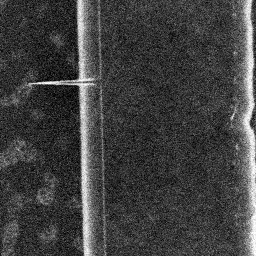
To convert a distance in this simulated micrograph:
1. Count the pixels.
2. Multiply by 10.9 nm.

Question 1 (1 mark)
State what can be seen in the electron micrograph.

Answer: one or a few lines or trenches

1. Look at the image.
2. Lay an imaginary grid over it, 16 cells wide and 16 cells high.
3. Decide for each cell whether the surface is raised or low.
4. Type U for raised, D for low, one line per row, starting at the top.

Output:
DDDDDUUUUUUUUUUU
DDDDDUUUUUUUUUUU
DDDDDUUUUUUUUUUU
DDDDDUUUUUUUUUUU
DDDDDUUUUUUUUUUU
DDDDDUUUUUUUUUUU
DDDDDUUUUUUUUUUU
DDDDDUUUUUUUUUUU
DDDDDUUUUUUUUUUU
DDDDDUUUUUUUUUUU
DDDDDUUUUUUUUUUU
DDDDDUUUUUUUUUUU
DDDDDUUUUUUUUUUU
DDDDDUUUUUUUUUUU
DDDDDUUUUUUUUUUU
DDDDDUUUUUUUUUUU